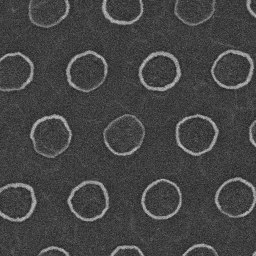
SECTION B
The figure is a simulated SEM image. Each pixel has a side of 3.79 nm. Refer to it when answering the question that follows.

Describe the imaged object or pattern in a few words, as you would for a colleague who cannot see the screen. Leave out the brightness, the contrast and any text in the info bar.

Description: a regular array of raised bodies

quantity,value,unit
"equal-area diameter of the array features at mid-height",153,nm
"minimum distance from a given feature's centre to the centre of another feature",275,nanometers